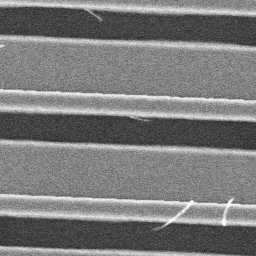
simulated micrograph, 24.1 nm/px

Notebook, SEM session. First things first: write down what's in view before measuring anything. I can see lines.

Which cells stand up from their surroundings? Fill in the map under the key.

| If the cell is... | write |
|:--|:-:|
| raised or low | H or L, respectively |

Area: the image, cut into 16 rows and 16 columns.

LLLLLLLHHHHHHHHH
LLLLLLLLLLLLLLLL
HHHHLLLLLLLLLLLL
HHHHHHHHHHHHHHHH
HHHHHHHHHHHHHHHH
HHHHHHHHHHHHHHHH
HHHHHHHHHHHHHHHH
LLLLLLLLLLLLLLLH
LLLLLLLLLLLLLLLL
HHHHHHHHHHHHHHHL
HHHHHHHHHHHHHHHH
HHHHHHHHHHHHHHHH
HHHHHHHHHHHHHHHH
LLLLHHHHHHHHHHHH
LLLLLLLLLLLLLLLL
HLLLLLLLLLLLLLLL